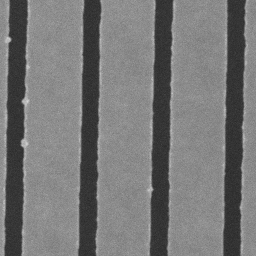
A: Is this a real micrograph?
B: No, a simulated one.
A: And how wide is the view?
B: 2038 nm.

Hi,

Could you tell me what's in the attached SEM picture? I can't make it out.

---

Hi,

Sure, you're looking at lines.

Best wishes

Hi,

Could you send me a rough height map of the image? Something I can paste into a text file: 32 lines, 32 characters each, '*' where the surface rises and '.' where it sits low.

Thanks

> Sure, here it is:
*...******...******...******...*
*...******...******...******...*
*..*******...******...******...*
*..*******...******..*******...*
*..*******...******...******...*
*..*******...******..*******...*
*..*******...******..*******...*
*..*******...******..*******...*
*..*******...******..*******...*
*..*******...******..*******...*
*..*******...******..*******...*
*..*******...******..*******..**
*..*******..*******..*******...*
*..*******..*******..*******...*
*..*******..*******..*******..**
*..*******..*******..*******..**
*..*******..*******..*******..**
*..*******..*******..*******..**
*..*******..*******..*******..**
*..*******..*******..*******..**
*..*******..*******..*******..**
*..*******..*******..*******..**
*..*******..*******..*******..**
*..*******..*******..*******..**
*..*******..*******..*******..**
*..*******..*******..*******..**
*..*******..*******..*******..**
*..*******..*******..*******..**
*..*******..*******..*******..**
*..*******..*******..*******..**
*..*******..*******..*******..**
...*******..*******..*******..**